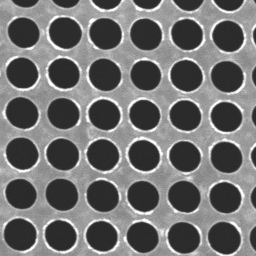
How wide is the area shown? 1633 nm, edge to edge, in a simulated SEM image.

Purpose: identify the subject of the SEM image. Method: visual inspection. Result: a regular array of holes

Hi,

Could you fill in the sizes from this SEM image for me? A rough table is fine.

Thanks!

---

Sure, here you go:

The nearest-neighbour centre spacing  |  257 nm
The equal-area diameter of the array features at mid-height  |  201 nm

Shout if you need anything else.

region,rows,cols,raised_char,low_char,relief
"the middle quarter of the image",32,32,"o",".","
...ooo.......oooo......oooo.....
....oo........ooo.......ooo.....
....oo........oo........oo......
....oo........ooo.......ooo.....
...oooo.......ooo.......ooo.....
...ooooo......oooo.....ooooo....
ooooooooo...ooooooo...ooooooo...
oooooooooooooooooooooooooooooooo
oooooooooooooooooooooooooooooooo
..oooooo....oooooo....oooooo....
...oooo......oooo......oooo.....
....oo........oo........ooo.....
....oo........oo........oo......
....oo........oo........oo......
...oooo.......ooo.......ooo.....
..oooooo.....ooooo.....ooooo....
oooooooooo.ooooooooo..ooooooo...
oooooooooooooooooooooooooooooooo
oooooooooooooooooooooooooooooooo
..ooooo.....oooooo....ooooooo..o
...ooo.......oooo......oooo.....
...ooo.......ooo........ooo.....
....oo........oo........oo......
....oo........oo........oo......
...ooo.......oooo.......ooo.....
...oooo......oooo......oooo.....
.oooooooo..oooooooo...ooooooo...
oooooooooooooooooooooooooooooooo
oooooooooooooooooooooooooooooooo
..ooooo....ooooooo...ooooooo...o
...ooo.......oooo.....ooooo.....
...ooo.......ooo.......ooo......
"